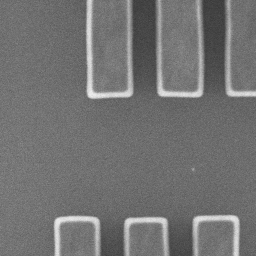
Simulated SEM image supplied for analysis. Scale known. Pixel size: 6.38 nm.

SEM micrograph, groups of lines, slits or small figures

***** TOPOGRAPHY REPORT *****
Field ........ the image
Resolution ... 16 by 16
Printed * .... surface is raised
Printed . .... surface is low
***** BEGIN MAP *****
......**..***.**
......**..***.**
......**..***.**
......**..***.**
......**..***.**
......**..***.**
................
................
................
................
................
................
................
................
....**..**..***.
....**..**..***.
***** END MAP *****